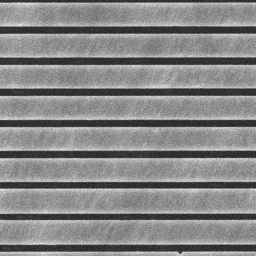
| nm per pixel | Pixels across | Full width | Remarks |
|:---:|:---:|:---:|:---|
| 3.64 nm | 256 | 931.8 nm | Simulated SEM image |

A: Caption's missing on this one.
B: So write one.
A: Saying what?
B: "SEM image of parallel lines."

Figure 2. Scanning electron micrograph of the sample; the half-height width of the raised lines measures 0.0874 microns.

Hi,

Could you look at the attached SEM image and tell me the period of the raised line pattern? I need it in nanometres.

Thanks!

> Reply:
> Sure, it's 113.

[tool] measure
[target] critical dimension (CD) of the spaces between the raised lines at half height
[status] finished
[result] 25.9 nm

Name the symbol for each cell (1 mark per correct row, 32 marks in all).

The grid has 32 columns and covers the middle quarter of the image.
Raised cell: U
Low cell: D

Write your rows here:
DDDDDDDDDDDDDDDDDDDDDDDDDDDDDDDD
UUUUUUUUUUUUUUUUUUUUUUUUUUUUUUUU
UUUUUUUUUUUUUUUUUUUUUUUUUUUUUUUU
UUUUUUUUUUUUUUUUUUUUUUUUUUUUUUUU
UUUUUUUUUUUUUUUUUUUUUUUUUUUUUUUU
UUUUUUUUUUUUUUUUUUUUUUUUUUUUUUUU
DDDDDDDDDDDDDDDDDDDDDDDDDDDDDDDD
DDDDDDDDDDDDDDDDDDDDDDDDDDDDDDDD
UUUUUUUUUUUUUUUUUUUUUUUUUUUUUUUU
UUUUUUUUUUUUUUUUUUUUUUUUUUUUUUUU
UUUUUUUUUUUUUUUUUUUUUUUUUUUUUUUU
UUUUUUUUUUUUUUUUUUUUUUUUUUUUUUUU
UUUUUUUUUUUUUUUUUUUUUUUUUUUUUUUU
UUUUUUUUUUUUUUUUUUUUUUUUUUUUUUUU
DDDDDDDDDDDDDDDDDDDDDDDDDDDDDDDD
DDDDDDDDDDDDDDDDDDDDDDDDDDDDDDDD
UUUUUUUUUUUUUUUUUUUUUUUUUUUUUUUU
UUUUUUUUUUUUUUUUUUUUUUUUUUUUUUUU
UUUUUUUUUUUUUUUUUUUUUUUUUUUUUUUU
UUUUUUUUUUUUUUUUUUUUUUUUUUUUUUUU
UUUUUUUUUUUUUUUUUUUUUUUUUUUUUUUU
UUUUUUUUUUUUUUUUUUUUUUUUUUUUUUUU
DDDDDDDDDDDDDDDDDDDDDDDDDDDDDDDD
DDDDDDDDDDDDDDDDDDDDDDDDDDDDDDDD
UUUUUUUUUUUUUUUUUUUUUUUUUUUUUUUU
UUUUUUUUUUUUUUUUUUUUUUUUUUUUUUUU
UUUUUUUUUUUUUUUUUUUUUUUUUUUUUUUU
UUUUUUUUUUUUUUUUUUUUUUUUUUUUUUUU
UUUUUUUUUUUUUUUUUUUUUUUUUUUUUUUU
DDDDDDDDDDDDDDDDDDDDDDDDDDDDDDDD
DDDDDDDDDDDDDDDDDDDDDDDDDDDDDDDD
UUUUUUUUUUUUUUUUUUUUUUUUUUUUUUUU